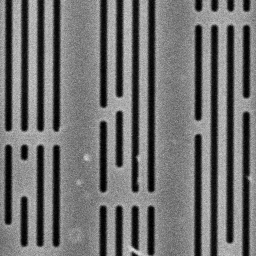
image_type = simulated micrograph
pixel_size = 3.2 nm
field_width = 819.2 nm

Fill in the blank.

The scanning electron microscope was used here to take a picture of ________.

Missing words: groups of lines, slits or small figures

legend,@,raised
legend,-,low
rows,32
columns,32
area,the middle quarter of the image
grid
@@@@@@@@@--@@--@@--@@--@@@@@@@@@
@@@@@@@@@--@@--@@--@@--@@@@@@@@@
@@@@@@@@@--@@--@@--@@--@@@@@@@@@
@@@@@@@@@--@@--@@--@@--@@@@@@@@@
@@@@@@@@@--@@--@@--@@--@@@@@@@@@
@@@@@@@@@--@@--@@--@@--@@@@@@@@@
@@@@@@@@@--@@--@@--@@--@@@@@@@@@
@@@@@@@@@--@@--@@--@@--@@@@@@@@@
@@@@@@@@@--@@@@@@--@@--@@@@@@@@@
@@@@@@@@@--@@@@@@--@@--@@@@@@@@@
@@@@@@@@@--@@@@@@--@@--@@@@@@@@@
@@@@@@@@@@@@@@@@@--@@--@@@@@@@@@
@@@@@@@@@@@@@--@@--@@--@@@@@@@@@
@@@@@@@@@@@@@--@@--@@--@@@@@@@@@
@@@@@@@@@--@@--@@--@@--@@@@@@@@@
@@@@@@@@@--@@--@@--@@--@@@@@@@@@
@@@@@@@@@--@@--@@--@@--@@@@@@@@@
@@@@@@@@@--@@--@@--@@--@@@@@@@@@
@@@@@@@@@--@@--@@--@@--@@@@@@@@@
@@@@@@@@@--@@--@@--@@--@@@@@@@@@
@@@@@@@@@--@@--@@--@@--@@@@@@@@@
@@@@@@@@@--@@--@@--@@--@@@@@@@@@
@@@@@@@@@--@@--@@--@@--@@@@@@@@@
@@@@@@@@@--@@--@@-@@@--@@@@@@@@@
@@@@@@@@@--@@--@@--@@--@@@@@@@@@
@@@@@@@@@--@@-@@@--@@--@@@@@@@@@
@@@@@@@@@--@@@@@@--@@--@@@@@@@@@
@@@@@@@@@--@@@@@@--@@--@@@@@@@@@
@@@@@@@@@--@@@@@@--@@--@@@@@@@@@
@@@@@@@@@--@@@@@@-@@@--@@@@@@@@@
@@@@@@@@@--@@@@@@--@@--@@@@@@@@@
@@@@@@@@@--@@@@@@--@@--@@@@@@@@@